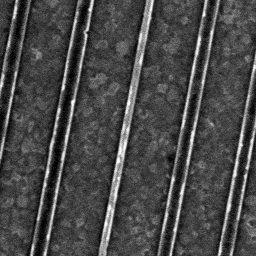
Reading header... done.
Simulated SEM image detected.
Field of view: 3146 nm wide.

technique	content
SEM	one or a few lines or trenches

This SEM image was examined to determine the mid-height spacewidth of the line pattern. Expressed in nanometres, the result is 627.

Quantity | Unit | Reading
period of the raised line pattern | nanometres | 758